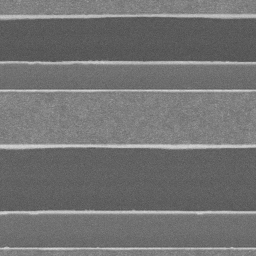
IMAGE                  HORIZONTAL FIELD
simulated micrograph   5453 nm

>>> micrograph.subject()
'lines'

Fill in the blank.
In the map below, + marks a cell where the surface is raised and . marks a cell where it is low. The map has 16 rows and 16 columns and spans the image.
++++++++++++++++
................
................
................
++++++++++++++++
++++++++++++++++
++++++++++++++++
++++++++++++++++
++++++++++++++++
................
................
................
................
++++++++++++++++
++++++++++++++++
++++++++++++++++